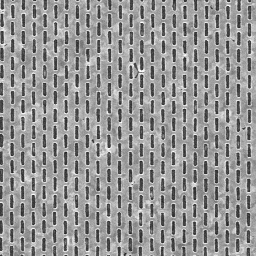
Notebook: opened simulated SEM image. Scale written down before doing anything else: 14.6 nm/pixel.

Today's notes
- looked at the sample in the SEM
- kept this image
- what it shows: a regular array of holes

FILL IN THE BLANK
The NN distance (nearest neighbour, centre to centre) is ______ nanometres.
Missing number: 196